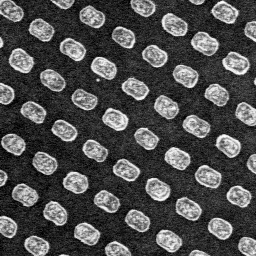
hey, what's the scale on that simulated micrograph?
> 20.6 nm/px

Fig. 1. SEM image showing a regular array of raised bodies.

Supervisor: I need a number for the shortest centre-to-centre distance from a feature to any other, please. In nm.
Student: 749